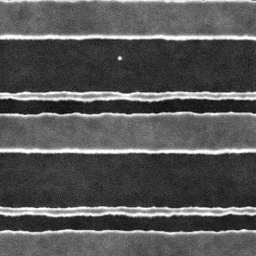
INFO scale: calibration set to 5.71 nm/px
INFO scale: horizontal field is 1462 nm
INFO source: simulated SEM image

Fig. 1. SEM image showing lines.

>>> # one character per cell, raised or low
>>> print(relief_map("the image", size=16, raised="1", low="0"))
1111111111111111
1111111111111111
0000000000000000
0000000000000000
0000000000000000
0000000000000000
1111111111111111
1111111111111111
1111111111111111
0000000000000000
0000000000000000
0000000000000000
0000000000000000
1111111111111111
1111111111111111
1111111111111111